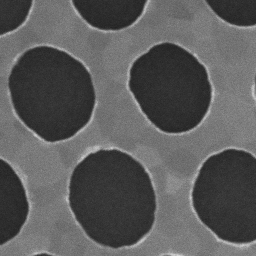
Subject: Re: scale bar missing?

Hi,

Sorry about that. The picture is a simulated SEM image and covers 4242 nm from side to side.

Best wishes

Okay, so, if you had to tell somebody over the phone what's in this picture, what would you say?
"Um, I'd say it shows holes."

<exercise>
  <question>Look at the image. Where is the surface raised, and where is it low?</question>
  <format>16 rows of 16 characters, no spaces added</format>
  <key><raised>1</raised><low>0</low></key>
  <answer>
0011100001111000
0111110011111100
1111111111111111
1000111110001111
1000011100000111
1000001100000111
1000001110000111
1000001110000111
1100111111111111
1111110011111101
0111100001111000
0111000000110000
0011000000110000
0011100000110000
0111100001111000
1111111111111111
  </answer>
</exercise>